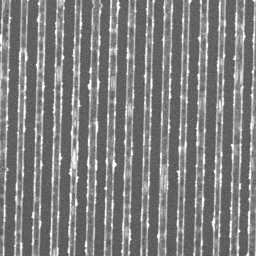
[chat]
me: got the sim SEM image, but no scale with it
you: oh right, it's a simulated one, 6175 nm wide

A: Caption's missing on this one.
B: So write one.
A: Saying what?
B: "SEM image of parallel lines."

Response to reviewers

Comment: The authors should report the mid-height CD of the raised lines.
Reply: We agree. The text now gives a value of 166 nm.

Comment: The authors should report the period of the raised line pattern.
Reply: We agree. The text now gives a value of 434 nm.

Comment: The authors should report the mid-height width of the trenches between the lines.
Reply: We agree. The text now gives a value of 268 nm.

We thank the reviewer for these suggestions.